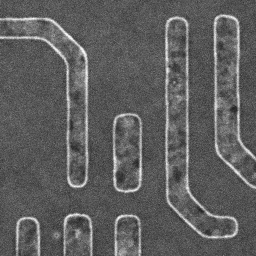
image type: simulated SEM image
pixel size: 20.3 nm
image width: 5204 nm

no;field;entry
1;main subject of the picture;wiring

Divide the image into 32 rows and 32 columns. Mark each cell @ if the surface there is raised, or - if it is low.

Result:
--------------------------------
--------------------------------
@@@@@@---------------@@----@@---
@@@@@@@@-------------@@----@@@--
@@@@@@@@@------------@@----@@@--
------@@@@-----------@@----@@@--
-------@@@@----------@@----@@@--
--------@@@----------@@----@@@--
--------@@@----------@@----@@@--
--------@@@----------@@----@@@--
--------@@@----------@@----@@@--
--------@@@----------@@----@@@--
--------@@@----------@@----@@@--
---------@@----------@@----@@@--
---------@@----@@----@@----@@@--
---------@@---@@@@---@@----@@@--
--------@@@---@@@@---@@----@@@--
--------@@@---@@@@---@@----@@@--
---------@@---@@@@---@@----@@@@-
---------@@---@@@@---@@----@@@@@
---------@@---@@@@---@@------@@@
---------@@---@@@@---@@-------@@
---------@@---@@@@---@@-------@@
---------------@@----@@@--------
---------------------@@@--------
---------------------@@@@-------
----------------------@@@@------
---@----@@@----@@------@@@@@@---
--@@@---@@@----@@-------@@@@@@--
--@@@---@@@----@@--------@@@@---
--@@@---@@@----@@---------------
--@@@---@@@----@@---------------